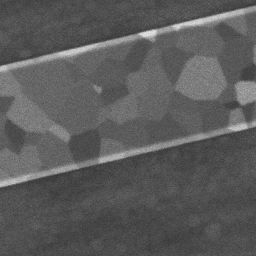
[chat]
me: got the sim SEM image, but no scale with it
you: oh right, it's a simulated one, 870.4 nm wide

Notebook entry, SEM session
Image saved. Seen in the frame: one or a few lines or trenches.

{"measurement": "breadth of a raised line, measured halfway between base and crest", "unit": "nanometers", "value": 387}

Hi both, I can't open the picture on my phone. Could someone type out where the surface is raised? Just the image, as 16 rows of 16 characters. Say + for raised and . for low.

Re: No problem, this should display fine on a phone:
................
............++++
.......+++++++++
...+++++++++++++
++++++++++++++++
++++++++++++++++
++++++++++++++++
++++++++++++++++
+++++++++++++...
+++++++++.......
+++++...........
................
................
................
................
................